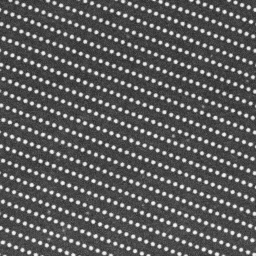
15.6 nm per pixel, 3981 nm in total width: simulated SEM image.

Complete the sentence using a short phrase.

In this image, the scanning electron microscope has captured a regular array of raised bodies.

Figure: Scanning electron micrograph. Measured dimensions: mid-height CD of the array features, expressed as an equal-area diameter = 52.6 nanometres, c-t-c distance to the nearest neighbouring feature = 108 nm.